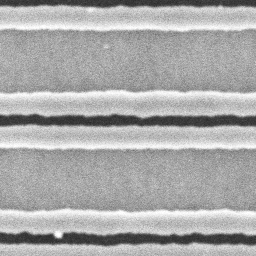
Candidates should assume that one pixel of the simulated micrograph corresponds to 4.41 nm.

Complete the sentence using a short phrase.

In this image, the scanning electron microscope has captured lines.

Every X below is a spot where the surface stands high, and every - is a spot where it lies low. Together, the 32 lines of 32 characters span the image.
--------------------------------
XXXXXXXXXXXXXXXXXXXXXXXXXXXXXXXX
XXXXXXXXXXXXXXXXXXXXXXXXXXXXXXXX
X-XXX-XXXXXXXXXXXXXXXXXXXXXXXXX-
--------------------------------
--------------------------------
--------------------------------
--------------------------------
--------------------------------
--------------------------------
--------------------------------
-------------XXX---X------------
XXXXXXXXXXXXXXXXXXXXXXXXXXXXXXXX
XXXXXXXXXXXXXXXXXXXXXXXXXXXXXXXX
-----------------XX-------------
--------------------------------
XXXXXXXXXXXXXXXXXXXXXXXXXXXXXXXX
XXXXXXXXXXXXXXXXXXXXXXXXXXXXXXXX
-----XX---XX---X-X----X-----X---
--------------------------------
--------------------------------
--------------------------------
--------------------------------
--------------------------------
--------------------------------
--------------------------------
XXX-XXXXXXXXXXXX--XXXXXXXXXXXXXX
XXXXXXXXXXXXXXXXXXXXXXXXXXXXXXXX
XXXXXXXXXXXXXXXXXXXXXXXXXXXXXXXX
-------X------------------------
---X--------------XX-X--XX------
XXXXXXXXXXXXXXXXXXXXXXXXXXXXXXXX